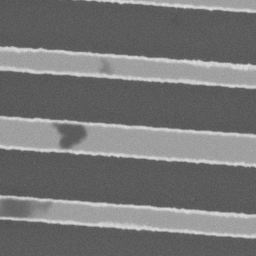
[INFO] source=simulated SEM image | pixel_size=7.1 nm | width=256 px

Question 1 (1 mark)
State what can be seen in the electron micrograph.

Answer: lines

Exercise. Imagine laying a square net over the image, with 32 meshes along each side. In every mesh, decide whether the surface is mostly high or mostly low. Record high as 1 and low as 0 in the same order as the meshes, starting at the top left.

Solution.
00000000000000000011111111111111
00000000000000000000000000000011
00000000000000000000000000000000
00000000000000000000000000000000
00000000000000000000000000000000
00000000000000000000000000000000
11111111100000000000000000000000
11111111111111111111110000000000
11111111111111111111111111111111
00000000011111111111111111111111
00000000000000000000000111111111
00000000000000000000000000000000
00000000000000000000000000000000
00000000000000000000000000000000
00000000000000000000000000000000
11111111111111000000000000000000
11111111111111111111111111100000
11111111111111111111111111111111
11111111111111111111111111111111
00000000000000011111111111111111
00000000000000000000000000001111
00000000000000000000000000000000
00000000000000000000000000000000
00000000000000000000000000000000
00000000000000000000000000000000
11111111111111000000000000000000
11111111111111111111111111000000
00011111111111111111111111111111
00000000000000011111111111111111
00000000000000000000000000000111
00000000000000000000000000000000
00000000000000000000000000000000